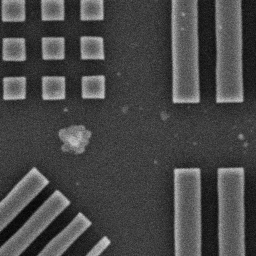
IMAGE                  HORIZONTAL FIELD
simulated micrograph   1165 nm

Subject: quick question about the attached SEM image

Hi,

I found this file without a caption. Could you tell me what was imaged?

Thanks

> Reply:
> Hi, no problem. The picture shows groups of lines, slits or small figures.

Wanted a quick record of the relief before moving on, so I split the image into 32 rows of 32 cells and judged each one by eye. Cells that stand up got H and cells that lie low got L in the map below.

HHHLLHHHLLHHHLLLLLLLLLHHHLLHHHLL
HHHLLHHHLLHHHLLLLLLLLLHHHLLHHHLL
HHHLLLHLLLLLLLLLLLLLLLHHHLLHHHLL
LLLLLLLLLLLLLLLLLLLLLLHHHLLHHHLL
LLLLLLLLLLLLLLLLLLLLLLHHHLLHHHLL
HHHLLHHHLLHHHLLLLLLLLLHHHLLHHHLL
HHHLLHHHLLHHHLLLLLLLLLHHHLLHHHLL
LHHLLLLLLLLLLLLLLLLLLLHHHLLHHHLL
LLLLLLLLLLLLLLLLLLLLLLHHHLLHHHLL
LLLLLLLLLLLLLLLLLLLLLLHHHLLHHHLL
LHHLLHHHLLHHHLLLLLLLLLHHHLLHHHLL
LHHLLHHHLLHHHLLLLLLLLLHHHLLHHHLL
LLLLLLLLLLLLLLLLLLLLLLHHHLLHHHLL
LLLLLLLLLLLLLLLLLLLLLLLLLLLLLLLL
LLLLLLLLLLLLLLLLLLLLLLLLLLLLLLLL
LLLLLLLLLLLLLLLLLLLLLLLLLLLLLLLL
LLLLLLLLLLLLLLLLLLLLLLLLLLLLLLLL
LLLLLLLLLHLLLLLLLLLLLLLLLLLLLLLL
LLLLLLLLLLLLLLLLLLLLLLLLLLLLLLLL
LLLLLLLLLLLLLLLLLLLLLLLLLLLLLLLL
LLLLLLLLLLLLLLLLLLLLLLLLLLLLLLLL
LLLLHLLLLLLLLLLLLLLLLLHHHLLHHHLL
LLLHHHLLLLLLLLLLLLLLLLHHHLLHHHLL
LLHHHLLLLLLLLLLLLLLLLLHHHLLHHHLL
LHHHLLHHLLLLLLLLLLLLLLHHHLLHHHLL
HHHLLHHHHLLLLLLLLLLLLLHHHLLHHHLL
HHLLHHHHLLLLLLLLLLLLLLHHHLLHHHLL
HHLLHHHLLHHLLLLLLLLLLLHHHLLHHHLL
HLLHHHLLHHHLLLLLLLLLLLHHHLLHHHLL
LLHHHLLHHHLLLLLLLLLLLLHHHLLHHHLL
LHHHLLHHHLLLHHLLLLLLLLHHHLLHHHHL
HHHLLHHHLLLHHLLLLLLLLLHHHLLHHHHL